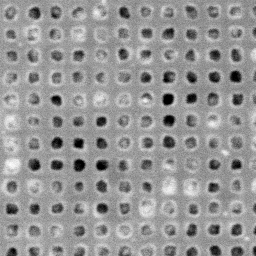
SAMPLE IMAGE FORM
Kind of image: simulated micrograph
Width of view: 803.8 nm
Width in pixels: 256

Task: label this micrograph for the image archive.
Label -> a regular array of holes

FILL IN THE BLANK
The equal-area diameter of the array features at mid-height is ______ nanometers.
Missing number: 39.2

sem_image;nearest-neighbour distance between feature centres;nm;66.9